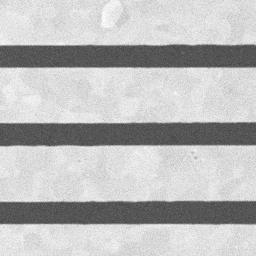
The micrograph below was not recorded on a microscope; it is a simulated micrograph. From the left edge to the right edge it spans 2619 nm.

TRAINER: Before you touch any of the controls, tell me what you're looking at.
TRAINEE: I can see lines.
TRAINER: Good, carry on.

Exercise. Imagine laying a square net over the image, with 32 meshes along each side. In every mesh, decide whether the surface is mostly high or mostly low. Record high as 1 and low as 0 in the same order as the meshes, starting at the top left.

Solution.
11111111111111111111111111111111
11111111111111111111111111111111
11111111111111111111111111111111
11111111111111111111111111111111
11111111111111111111111111111111
11111111111111111111100110011111
00000000000000000000000000000000
00000000000000000000000000000000
00000000000000000000000000000000
11111111111111111111111111111111
11111111111111111111111111111111
11111111111111111111111111111111
11111111111111111111111111111111
11111111111111111111111111111111
11111111111111111111111111111111
00000000000000000000000000000000
00000000000000000000000000000000
00000000000000000000000000000000
11111111111111111111111111111111
11111111111111111111111111111111
11111111111111111111111111111111
11111111111111111111111111111111
11111111111111111111111111111111
11111111111111111111111111111111
11111111111111111111111111111111
00000000000000000000000000000000
00000000000000000000000000000000
00000000000000000000000000000000
11111111111111111111111111111111
11111111111111111111111111111111
11111111111111111111111111111111
11111111111111111111111111111111